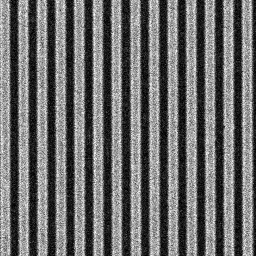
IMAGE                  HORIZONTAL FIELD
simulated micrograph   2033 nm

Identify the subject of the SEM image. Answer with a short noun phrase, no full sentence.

parallel lines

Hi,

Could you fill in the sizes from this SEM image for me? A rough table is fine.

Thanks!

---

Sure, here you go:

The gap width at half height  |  71.5 nm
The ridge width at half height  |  79.4 nanometers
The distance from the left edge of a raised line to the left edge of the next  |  148 nanometres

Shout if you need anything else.